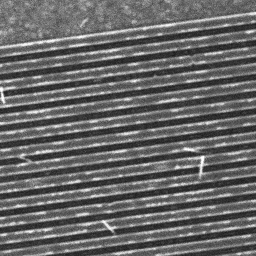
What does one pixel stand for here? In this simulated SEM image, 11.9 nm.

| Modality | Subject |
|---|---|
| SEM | parallel lines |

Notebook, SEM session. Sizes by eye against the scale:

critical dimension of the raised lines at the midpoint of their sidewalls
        113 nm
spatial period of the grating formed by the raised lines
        16.9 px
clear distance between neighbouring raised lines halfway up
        82.5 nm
